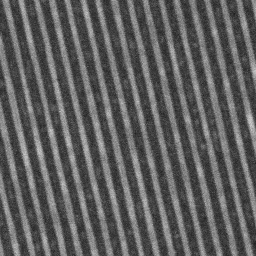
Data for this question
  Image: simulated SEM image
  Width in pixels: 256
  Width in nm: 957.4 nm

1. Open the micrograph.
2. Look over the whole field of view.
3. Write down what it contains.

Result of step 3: parallel lines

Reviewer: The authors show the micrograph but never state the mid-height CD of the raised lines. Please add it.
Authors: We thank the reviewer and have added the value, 16.9 nm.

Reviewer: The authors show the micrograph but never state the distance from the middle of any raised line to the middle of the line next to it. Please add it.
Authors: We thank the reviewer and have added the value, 56.6 nm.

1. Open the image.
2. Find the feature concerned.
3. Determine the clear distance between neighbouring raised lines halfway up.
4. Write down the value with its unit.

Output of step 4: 0.0401 um